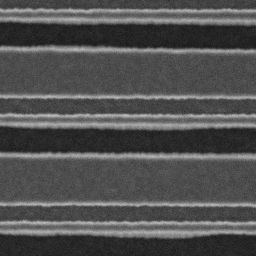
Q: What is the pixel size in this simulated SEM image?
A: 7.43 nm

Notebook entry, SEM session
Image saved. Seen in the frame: lines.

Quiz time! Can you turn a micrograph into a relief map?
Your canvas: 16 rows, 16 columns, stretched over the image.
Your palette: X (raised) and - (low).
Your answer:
XXXXXXXXXXXXXXXX
----------------
----------------
XXXXXXXXXXXXXXXX
XXXXXXXXXXXXXXXX
XXXXXXXXXXXXXXXX
XXXXXXXXXXXXXXXX
XXXXXXXXXXXXXXXX
----------------
----------------
XXXXXXXXXXXXXXXX
XXXXXXXXXXXXXXXX
XXXXXXXXXXXXXXXX
XXXXXXXXXXXXXXXX
XXXXXXXXXXXXXXXX
----------------